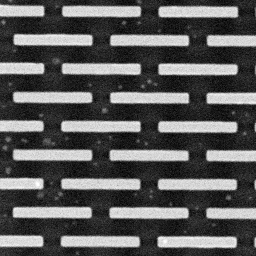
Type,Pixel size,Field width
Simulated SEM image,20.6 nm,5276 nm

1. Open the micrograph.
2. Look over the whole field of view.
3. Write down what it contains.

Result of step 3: groups of lines, slits or small figures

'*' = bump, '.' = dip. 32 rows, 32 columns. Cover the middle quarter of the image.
*******************.....********
*******************.....********
................................
................................
................................
................................
................................
*******.....*******************.
*******.....*******************.
*******.....*******************.
................................
................................
................................
................................
................................
*******************.....********
*******************.....********
................................
................................
................................
................................
................................
*******.....*******************.
*******.....*******************.
................................
................................
................................
................................
................................
*******************.....********
*******************.....********
................................